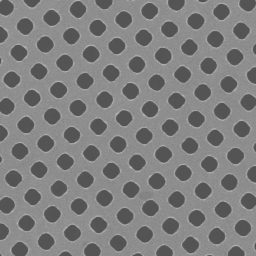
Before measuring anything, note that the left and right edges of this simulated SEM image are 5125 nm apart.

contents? a regular array of holes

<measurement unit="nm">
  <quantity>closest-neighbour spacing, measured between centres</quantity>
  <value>536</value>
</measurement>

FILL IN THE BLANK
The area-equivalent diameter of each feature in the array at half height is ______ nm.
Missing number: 326